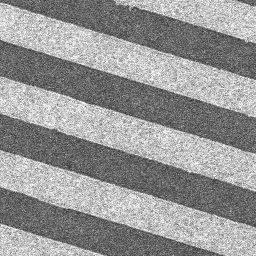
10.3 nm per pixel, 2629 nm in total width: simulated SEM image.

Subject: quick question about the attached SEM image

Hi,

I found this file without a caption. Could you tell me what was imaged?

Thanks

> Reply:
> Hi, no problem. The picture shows one or a few lines or trenches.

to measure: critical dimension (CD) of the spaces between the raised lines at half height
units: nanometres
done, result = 365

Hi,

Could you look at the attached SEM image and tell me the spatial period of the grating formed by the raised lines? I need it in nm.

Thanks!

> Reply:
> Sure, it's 724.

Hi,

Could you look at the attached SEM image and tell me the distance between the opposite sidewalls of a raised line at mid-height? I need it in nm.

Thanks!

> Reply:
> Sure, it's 355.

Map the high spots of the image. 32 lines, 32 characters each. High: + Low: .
...............+++++++++++++++..
++++...............+++++++++++++
+++++++................+++++++++
++++++++++................++++++
++++++++++++++...............+++
..+++++++++++++++...............
.....+++++++++++++++............
.........++++++++++++++.........
............+++++++++++++++.....
...............+++++++++++++++..
+++...............++++++++++++++
++++++................++++++++++
+++++++++................+++++++
+++++++++++++...............++++
.+++++++++++++++...............+
....+++++++++++++++.............
........+++++++++++++++.........
...........+++++++++++++++......
..............+++++++++++++++...
++................++++++++++++++
+++++................+++++++++++
+++++++++...............++++++++
++++++++++++...............+++++
.++++++++++++++................+
....+++++++++++++++.............
.......+++++++++++++++..........
...........++++++++++++++.......
..............+++++++++++++++...
+................+++++++++++++++
+++++...............++++++++++++
++++++++...............+++++++++
+++++++++++................+++++